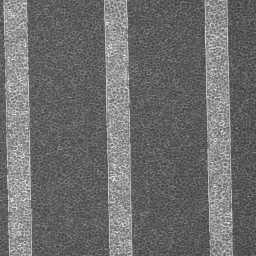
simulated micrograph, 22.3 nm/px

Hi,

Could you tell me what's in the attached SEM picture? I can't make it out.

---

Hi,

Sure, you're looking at one or a few lines or trenches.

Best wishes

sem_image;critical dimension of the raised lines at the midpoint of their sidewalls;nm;502